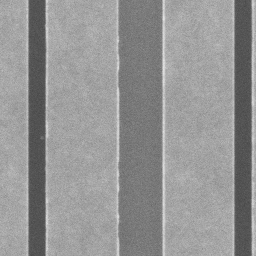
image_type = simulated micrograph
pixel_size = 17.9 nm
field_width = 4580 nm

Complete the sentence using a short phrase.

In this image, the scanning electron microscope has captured lines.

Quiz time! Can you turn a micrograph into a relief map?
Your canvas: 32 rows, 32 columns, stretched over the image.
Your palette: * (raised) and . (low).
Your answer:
***...*********.....*********...
***...*********.....*********...
***...*********.....*********...
***...*********.....*********...
***...*********.....*********...
***...*********.....*********...
***...*********.....*********...
***...*********.....*********...
***...*********.....*********...
***...*********.....*********...
***...*********.....*********...
***...*********.....*********...
***...*********.....*********...
***...*********.....*********...
***...*********.....*********...
***...*********.....*********...
***...*********.....*********...
***...*********.....*********...
***...*********.....*********...
***...*********.....*********...
***...*********.....*********...
***...*********.....*********...
***...*********.....*********...
***...*********.....*********...
***...*********.....*********...
***...*********.....*********...
***...*********.....*********...
***...*********.....*********...
***...*********.....*********...
***...*********.....*********...
***...*********.....*********...
***...*********.....*********...